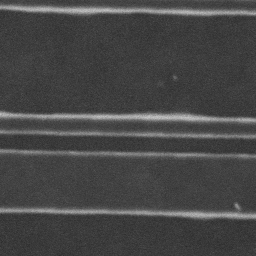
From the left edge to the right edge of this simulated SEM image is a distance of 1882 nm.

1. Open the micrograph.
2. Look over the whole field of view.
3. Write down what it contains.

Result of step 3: lines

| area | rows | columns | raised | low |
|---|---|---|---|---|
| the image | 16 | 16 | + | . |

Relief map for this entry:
..++++++++++++++
................
................
................
................
................
................
+++++++++++++...
++++++++++++++++
++++++++++++++++
++++++++++++++++
++++++++++++++++
++++++++++++++++
................
................
................